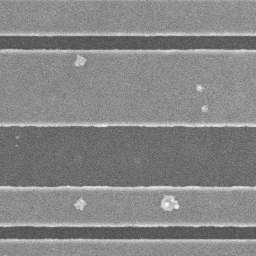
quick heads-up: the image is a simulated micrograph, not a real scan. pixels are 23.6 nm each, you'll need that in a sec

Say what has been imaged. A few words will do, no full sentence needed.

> lines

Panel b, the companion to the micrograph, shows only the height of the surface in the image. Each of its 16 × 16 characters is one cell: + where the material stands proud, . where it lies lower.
++++++++++++++++
++++++++++++++++
++++++++++++++++
++++++++++++++++
++++++++++++++++
++++++++++++++++
++++++++++++++++
++++++++++++++++
................
................
................
................
++++++++++++++++
++++++++++++++++
++++++++++++++++
++++++++++++++++